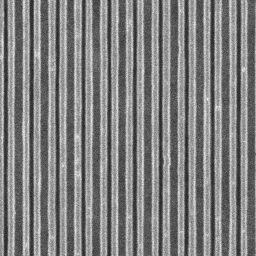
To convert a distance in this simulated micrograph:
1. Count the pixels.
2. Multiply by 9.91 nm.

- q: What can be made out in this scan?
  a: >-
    parallel lines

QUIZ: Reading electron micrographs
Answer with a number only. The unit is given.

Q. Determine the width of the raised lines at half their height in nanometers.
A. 61.9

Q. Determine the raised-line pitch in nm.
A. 128